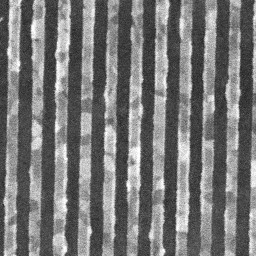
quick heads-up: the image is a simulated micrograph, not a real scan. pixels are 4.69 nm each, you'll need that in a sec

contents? parallel lines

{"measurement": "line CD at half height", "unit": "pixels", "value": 10.7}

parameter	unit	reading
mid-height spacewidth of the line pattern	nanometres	63.3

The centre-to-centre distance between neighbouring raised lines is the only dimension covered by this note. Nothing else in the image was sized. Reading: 115 nm